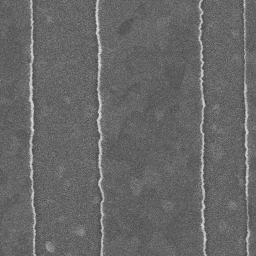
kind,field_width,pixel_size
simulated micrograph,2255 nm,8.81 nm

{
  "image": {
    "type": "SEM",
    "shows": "one or a few lines or trenches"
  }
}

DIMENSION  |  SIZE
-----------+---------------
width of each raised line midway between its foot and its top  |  912 nm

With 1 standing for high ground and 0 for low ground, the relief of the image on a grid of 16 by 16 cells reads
1100001111111001
1100001111111001
1100001111111001
1100001111111001
1100001111111001
1100001111111001
1100001111111001
1100001111111001
1100001111111001
1100001111111001
1100001111111001
1100001111111001
1100001111111001
1100001111111001
1100001111111001
1100001111111001